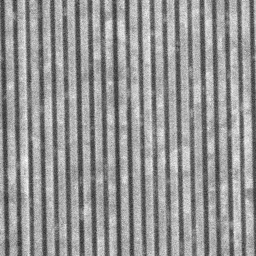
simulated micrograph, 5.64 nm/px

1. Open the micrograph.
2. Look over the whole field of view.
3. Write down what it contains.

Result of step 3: parallel lines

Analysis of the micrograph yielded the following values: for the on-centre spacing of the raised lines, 12.4 pixels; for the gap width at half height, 32.4 nanometres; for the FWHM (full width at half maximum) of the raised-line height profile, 38 nm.